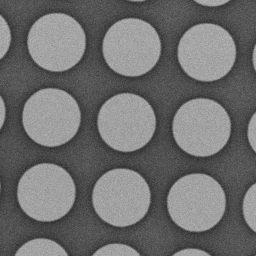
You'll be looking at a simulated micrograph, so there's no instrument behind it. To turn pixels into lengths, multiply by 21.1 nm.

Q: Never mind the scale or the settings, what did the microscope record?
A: an array of small figures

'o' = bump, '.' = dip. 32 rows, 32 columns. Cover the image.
.........................ooo....
................................
o....oooo......ooo..............
o...oooooo....ooooo.....oooo....
o...ooooooo..ooooooo...oooooo...
o...ooooooo..ooooooo..ooooooo...
o...oooooo...ooooooo..ooooooo...
....oooooo...ooooooo..ooooooo...
......ooo.....ooooo....oooooo...
........................oooo....
................................
.....ooo........................
....ooooo.....oooo......oo......
o..ooooooo...oooooo....ooooo....
o..ooooooo..ooooooo...oooooo....
...ooooooo..ooooooo...ooooooo..o
...oooooo...ooooooo...ooooooo..o
....ooooo....oooooo...oooooo...o
..............ooo......ooooo....
................................
................................
...ooooo......ooo...............
...oooooo...oooooo....ooooo.....
..ooooooo...ooooooo..ooooooo...o
..ooooooo...ooooooo..ooooooo...o
..ooooooo...ooooooo..ooooooo..oo
...ooooo....oooooo...ooooooo..oo
.....oo......oooo.....ooooo....o
.......................ooo.....o
................................
...oooo.........................
..oooooo....ooooo.....ooo.......